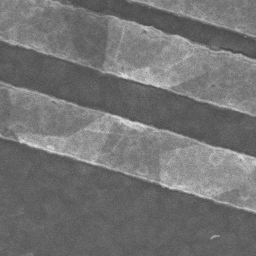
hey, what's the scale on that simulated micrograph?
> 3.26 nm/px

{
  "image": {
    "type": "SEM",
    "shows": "one or a few lines or trenches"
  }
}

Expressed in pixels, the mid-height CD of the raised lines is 52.